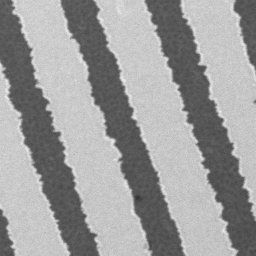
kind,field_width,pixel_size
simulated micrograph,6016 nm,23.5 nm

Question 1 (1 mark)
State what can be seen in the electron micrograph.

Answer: one or a few lines or trenches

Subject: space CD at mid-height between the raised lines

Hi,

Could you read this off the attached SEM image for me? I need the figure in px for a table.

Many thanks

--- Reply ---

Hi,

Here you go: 33.3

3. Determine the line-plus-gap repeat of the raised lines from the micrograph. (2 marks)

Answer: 1860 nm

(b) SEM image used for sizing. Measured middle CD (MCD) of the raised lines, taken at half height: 1.09 micrometres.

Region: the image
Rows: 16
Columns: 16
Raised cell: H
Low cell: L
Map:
LHHHLLHHHLLHHHHL
LHHHLLHHHHLLHHHL
LLHHHLLHHHLLHHHL
LLHHHLLHHHLLHHHL
LLHHHLLLHHHLLHHH
LLLHHHLLHHHLLHHH
HLLHHHLLHHHLLHHH
HLLHHHHLLHHHLLHH
HLLLHHHLLHHHLLHH
HHLLHHHLLHHHLLLH
HHLLHHHHLLHHHLLH
HHHLLHHHLLHHHLLH
HHHLLHHHLLHHHHLL
HHHLLHHHHLLHHHLL
LHHHLLHHHLLHHHLL
LHHHLLHHHLLHHHHL